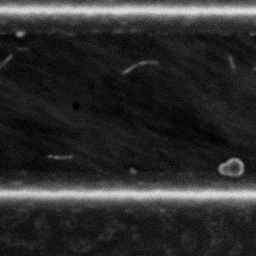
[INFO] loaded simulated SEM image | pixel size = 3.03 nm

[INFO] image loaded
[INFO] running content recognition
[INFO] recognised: one or a few lines or trenches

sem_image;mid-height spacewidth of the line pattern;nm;554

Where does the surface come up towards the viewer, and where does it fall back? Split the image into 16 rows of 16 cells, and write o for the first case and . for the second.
oooooooooooooooo
................
................
................
................
................
................
................
................
................
................
................
oooooooooooooooo
oooooooooooooooo
oooooooooooooooo
oooooooooooooooo